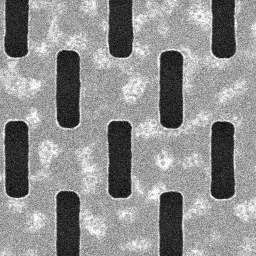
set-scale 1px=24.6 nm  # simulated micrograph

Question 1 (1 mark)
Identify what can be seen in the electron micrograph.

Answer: holes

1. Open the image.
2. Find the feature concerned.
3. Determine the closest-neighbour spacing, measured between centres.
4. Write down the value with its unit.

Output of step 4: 2140 nm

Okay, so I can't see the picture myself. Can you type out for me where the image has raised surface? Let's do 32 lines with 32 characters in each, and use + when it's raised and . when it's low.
+...++++++++++...+++++++++...+++
+...++++++++++...+++++++++...+++
+...+++++++++....+++++++++...+++
+...+++++++++....+++++++++...+++
+...+++++++++....+++++++++...+++
....+++++++++....+++++++++....++
+..++++..+++++...+++..++++...+++
+++++++...++++++++++...+++++++++
+++++++...++++++++++...+++++++++
+++++++...++++++++++...+++++++++
+++++++...++++++++++...+++++++++
+++++++...++++++++++...+++++++++
+++++++...++++++++++...+++++++++
+++++++...++++++++++...+++++++++
+++++++...++++++++++...+++++++++
+..++++...++++..++++...++++..+++
+...+++++++++....+++++++++...+++
+...+++++++++....+++++++++...+++
+...+++++++++....+++++++++...+++
+...++++++++++...+++++++++...+++
+...++++++++++...+++++++++...+++
+...++++++++++...+++++++++...+++
+...+++++++++....+++++++++...+++
+...++++++++++...+++++++++...+++
+..++++...++++..++++...++++..+++
+++++++...++++++++++...+++++++++
+++++++...++++++++++...+++++++++
+++++++...++++++++++...+++++++++
+++++++...++++++++++...+++++++++
+++++++...++++++++++...+++++++++
+++++++...++++++++++...+++++++++
+++++++...++++++++++...+++++++++